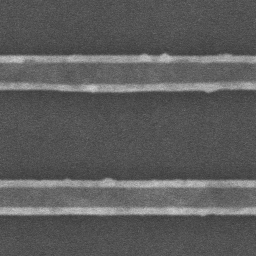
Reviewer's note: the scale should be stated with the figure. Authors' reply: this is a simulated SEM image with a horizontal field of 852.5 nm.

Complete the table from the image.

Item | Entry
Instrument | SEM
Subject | one or a few lines or trenches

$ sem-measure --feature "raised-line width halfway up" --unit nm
109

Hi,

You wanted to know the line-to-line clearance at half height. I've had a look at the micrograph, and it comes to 302 nm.